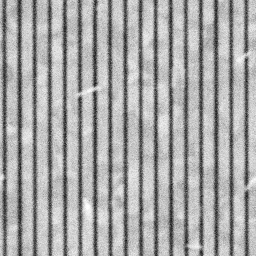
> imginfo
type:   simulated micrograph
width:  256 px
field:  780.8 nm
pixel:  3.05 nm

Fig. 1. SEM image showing parallel lines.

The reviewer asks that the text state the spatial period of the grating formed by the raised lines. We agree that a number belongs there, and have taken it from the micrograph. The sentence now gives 0.0461 um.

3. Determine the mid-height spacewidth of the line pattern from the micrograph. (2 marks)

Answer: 13.7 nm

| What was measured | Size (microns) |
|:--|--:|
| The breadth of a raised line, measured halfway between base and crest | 0.0328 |